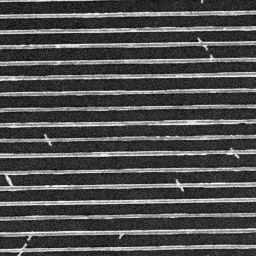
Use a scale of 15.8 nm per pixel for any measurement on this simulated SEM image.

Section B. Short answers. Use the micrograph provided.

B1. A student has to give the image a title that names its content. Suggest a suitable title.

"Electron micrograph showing parallel lines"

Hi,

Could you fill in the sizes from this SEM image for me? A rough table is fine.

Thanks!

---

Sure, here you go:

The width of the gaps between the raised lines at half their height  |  12.6 px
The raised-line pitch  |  247 nm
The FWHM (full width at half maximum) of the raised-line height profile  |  47.5 nanometers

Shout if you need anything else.